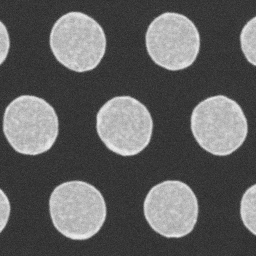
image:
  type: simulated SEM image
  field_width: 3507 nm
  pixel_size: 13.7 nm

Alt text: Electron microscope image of raised bodies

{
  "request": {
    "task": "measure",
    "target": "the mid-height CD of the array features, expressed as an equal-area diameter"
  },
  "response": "55.4 px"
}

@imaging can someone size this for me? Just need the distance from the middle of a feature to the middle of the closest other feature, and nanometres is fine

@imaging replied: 1290